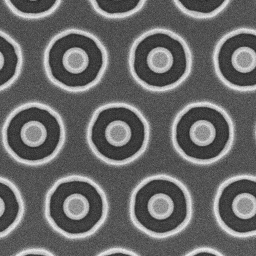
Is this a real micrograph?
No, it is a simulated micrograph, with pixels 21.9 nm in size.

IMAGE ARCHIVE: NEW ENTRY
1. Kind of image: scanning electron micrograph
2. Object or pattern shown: an array of small figures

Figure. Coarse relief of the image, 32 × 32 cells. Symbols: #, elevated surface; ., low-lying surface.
#......#####......####......####
##....#######...########...#####
################################
################################
.#######...#######....#######...
..####......#####......#####....
..####...#...####..##..####...#.
..####..###..####..##...###..###
..####...#...####..##..####...#.
..####......#####......#####....
.#######...#######....#######...
################################
################################
###..########...########...#####
##.....#####.....######.....####
#...#...###...#...####...#...###
#..##...###...##..####..###..###
#..##...###...##..####..##...###
#......#####......####......####
##....#######....######....#####
################################
################################
########...########..########...
..#####.....#####......#####....
..####.......####......####.....
...###..###..####..##...###..###
...###..###..####..##...###...##
..####.......####......#####....
.######.....######....######....
#########.######################
################################
####.#########..#########..#####